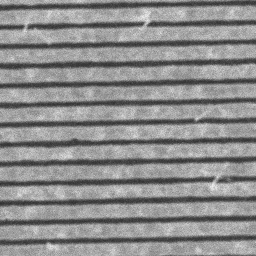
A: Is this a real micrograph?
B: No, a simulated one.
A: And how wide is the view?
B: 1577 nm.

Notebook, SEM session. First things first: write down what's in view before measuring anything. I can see parallel lines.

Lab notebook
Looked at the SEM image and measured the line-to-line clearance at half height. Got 38.5 nm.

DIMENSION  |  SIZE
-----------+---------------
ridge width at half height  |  83.1 nm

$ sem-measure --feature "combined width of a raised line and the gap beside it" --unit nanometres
120